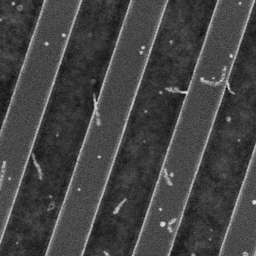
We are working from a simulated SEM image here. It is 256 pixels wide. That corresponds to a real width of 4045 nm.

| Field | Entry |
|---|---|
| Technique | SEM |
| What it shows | lines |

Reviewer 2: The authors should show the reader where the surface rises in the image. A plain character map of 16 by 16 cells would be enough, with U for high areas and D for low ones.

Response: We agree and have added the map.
DDDUUDDDUUDDDUUU
DDUUUDDDUUDDDUUD
DDUUDDDUUUDDDUUD
DDUUDDDUUDDDUUUD
DUUUDDDUUDDDUUDD
DUUDDDUUUDDDUUDD
DUUDDDUUDDDUUUDD
UUUDDDUUDDDUUDDD
UUDDDUUUDDDUUDDD
UUDDDUUDDDUUUDDD
UUDDDUUDDDUUDDDD
UDDDUUUDDDUUDDDU
UDDDUUDDDUUUDDDU
UDDDUUDDDUUDDDUU
DDDUUUDDDUUDDDUU
DDDUUDDDUUUDDDUU